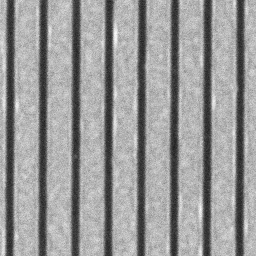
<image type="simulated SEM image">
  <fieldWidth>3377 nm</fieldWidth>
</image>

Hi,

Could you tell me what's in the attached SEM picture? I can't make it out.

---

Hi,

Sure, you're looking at parallel lines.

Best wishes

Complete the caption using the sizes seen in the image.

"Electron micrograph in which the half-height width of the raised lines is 158 nm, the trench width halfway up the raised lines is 279 nanometres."